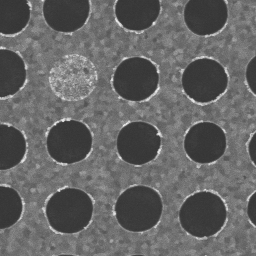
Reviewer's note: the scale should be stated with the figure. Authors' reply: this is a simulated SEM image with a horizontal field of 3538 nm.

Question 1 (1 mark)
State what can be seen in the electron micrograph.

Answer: a regular array of holes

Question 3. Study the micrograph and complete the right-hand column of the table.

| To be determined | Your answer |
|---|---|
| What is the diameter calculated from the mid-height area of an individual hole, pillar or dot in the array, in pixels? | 44.4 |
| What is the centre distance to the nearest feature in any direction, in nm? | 888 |